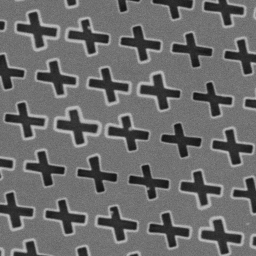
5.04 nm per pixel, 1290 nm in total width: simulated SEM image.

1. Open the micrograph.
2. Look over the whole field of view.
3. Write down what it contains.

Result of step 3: an array of small figures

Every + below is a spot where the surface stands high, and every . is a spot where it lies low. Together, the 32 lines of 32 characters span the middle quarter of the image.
++++++++++++++++++++++++++++++++
+++++++++...++++++++++++++++++++
+++++++++...++++++++++...+++++++
...++++++...++++++++++...+++++++
...+++........++++++++...+++++++
++++++...........++......+++++++
++++++++++......+++..........+++
++++++++++...++++++..........+++
+++++++++++..++++++++++......+++
+++++++++++..++++++++++...++++++
+++++++++++++++++++++++...++++++
+...++++++++++++++++++++.+++++++
+...++++++++++++++++++++++++++++
+...++++++++++...+++++++++++++++
.......+++++++...+++++++++++++++
.........++..+...++++++++++...++
.........++........+++++++++..++
++......+++..........++++++...++
++...++++++++.+......+++........
++...++++++++++...+++++++.......
++++++++++++++++..++++++++++...+
++++++++++++++++..+++++++++++..+
+++++++++++++++++++++++++++++..+
++++++...+++++++++++++++++++++++
++++++...+++++++++++++++++++++++
+++++++..+++++++++++.+++++++++++
+++......++++++++++...++++++++++
+++..........+++++++..++++++++++
++++++.......+++......++++++++++
++++++++..++.+++..........+++...
++++++++..++++++++++......+++...
++++++++..+++++++++++..++++++...